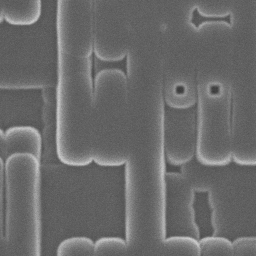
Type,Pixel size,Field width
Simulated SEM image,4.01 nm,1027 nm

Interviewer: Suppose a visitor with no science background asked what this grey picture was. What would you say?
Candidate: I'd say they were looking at wiring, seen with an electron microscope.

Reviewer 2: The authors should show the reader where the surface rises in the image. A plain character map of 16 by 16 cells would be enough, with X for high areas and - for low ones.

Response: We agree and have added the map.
XX--XXXXXXXXXXXX
-X--XXXXXXXXXXXX
----XXXXXXXXXXXX
----XXXXXXXXXXXX
----XXXXXXXXXXXX
----XXXXXXXXXXXX
----XXXXXXXXXXXX
----XXXXXX--XXXX
----XXXXXX--XXXX
----XXXXXX--XXXX
XX------XX------
XX------XX------
XX------XX------
XX------XX------
XX------XX------
XX--XXXXXXXXXXXX